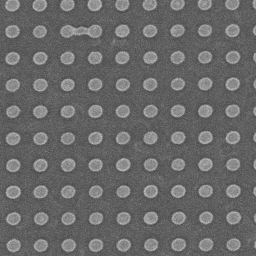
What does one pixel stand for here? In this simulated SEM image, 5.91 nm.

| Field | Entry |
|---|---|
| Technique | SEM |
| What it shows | a regular array of raised bodies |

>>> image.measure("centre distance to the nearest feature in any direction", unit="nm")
157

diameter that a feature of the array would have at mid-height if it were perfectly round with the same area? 74.8 nanometers